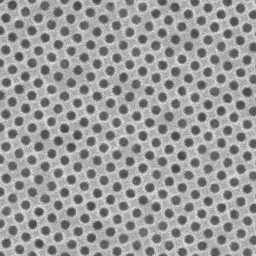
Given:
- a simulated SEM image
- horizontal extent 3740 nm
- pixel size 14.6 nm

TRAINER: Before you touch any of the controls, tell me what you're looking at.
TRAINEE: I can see a regular array of holes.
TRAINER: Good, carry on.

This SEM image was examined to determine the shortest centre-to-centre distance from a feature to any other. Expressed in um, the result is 0.207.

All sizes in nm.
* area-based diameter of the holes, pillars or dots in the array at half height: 156